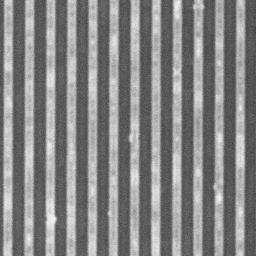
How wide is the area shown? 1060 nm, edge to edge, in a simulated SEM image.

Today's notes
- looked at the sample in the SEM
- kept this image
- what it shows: parallel lines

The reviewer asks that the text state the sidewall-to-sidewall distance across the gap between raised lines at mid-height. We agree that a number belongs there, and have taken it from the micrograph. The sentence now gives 53.3 nanometers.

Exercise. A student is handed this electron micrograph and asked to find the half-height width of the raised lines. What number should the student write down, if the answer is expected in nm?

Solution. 34.1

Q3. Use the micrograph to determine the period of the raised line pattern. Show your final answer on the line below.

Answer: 87.3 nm